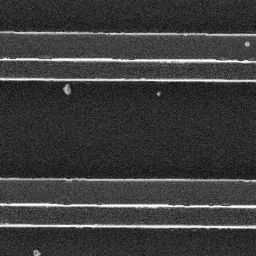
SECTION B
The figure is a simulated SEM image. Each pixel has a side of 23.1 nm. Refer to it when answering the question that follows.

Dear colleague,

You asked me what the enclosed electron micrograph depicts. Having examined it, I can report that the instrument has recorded lines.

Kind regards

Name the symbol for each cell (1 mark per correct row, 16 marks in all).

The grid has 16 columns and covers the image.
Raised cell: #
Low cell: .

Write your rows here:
................
................
################
################
################
................
................
................
................
................
................
################
################
################
................
................